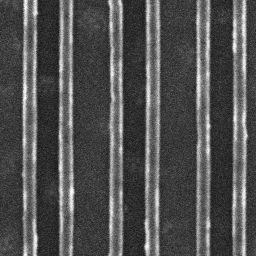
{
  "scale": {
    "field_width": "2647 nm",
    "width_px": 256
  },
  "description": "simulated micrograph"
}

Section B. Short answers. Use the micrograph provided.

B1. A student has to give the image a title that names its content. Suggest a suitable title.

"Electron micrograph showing parallel lines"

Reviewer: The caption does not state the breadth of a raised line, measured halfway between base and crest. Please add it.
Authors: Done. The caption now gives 133 nm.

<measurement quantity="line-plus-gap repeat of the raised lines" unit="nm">434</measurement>